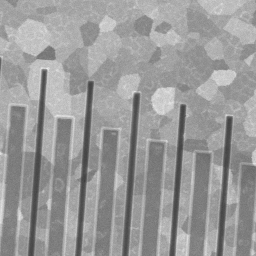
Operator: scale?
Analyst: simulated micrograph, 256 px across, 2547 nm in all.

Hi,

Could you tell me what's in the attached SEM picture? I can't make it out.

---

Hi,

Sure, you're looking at parallel lines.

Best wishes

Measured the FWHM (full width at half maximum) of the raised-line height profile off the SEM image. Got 127 nm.